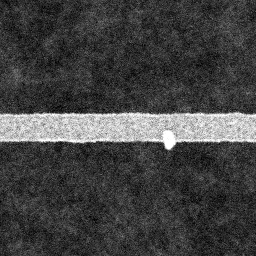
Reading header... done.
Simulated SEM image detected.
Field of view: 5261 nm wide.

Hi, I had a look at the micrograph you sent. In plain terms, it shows one or a few lines or trenches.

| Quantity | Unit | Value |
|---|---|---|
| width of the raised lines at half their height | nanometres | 540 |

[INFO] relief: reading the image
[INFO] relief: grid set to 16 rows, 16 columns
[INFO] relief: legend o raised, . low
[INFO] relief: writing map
................
................
................
................
................
................
................
oooooooooooooooo
oooooooooooooooo
................
................
................
................
................
................
................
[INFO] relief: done